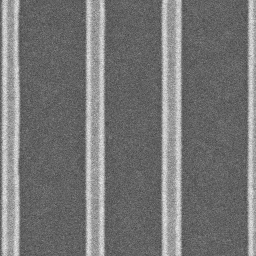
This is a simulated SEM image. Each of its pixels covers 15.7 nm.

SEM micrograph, one or a few lines or trenches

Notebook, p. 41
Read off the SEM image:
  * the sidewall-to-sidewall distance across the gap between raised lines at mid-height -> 1.13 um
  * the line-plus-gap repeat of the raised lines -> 1260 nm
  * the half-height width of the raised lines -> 202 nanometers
